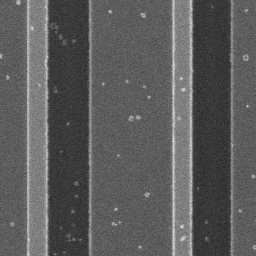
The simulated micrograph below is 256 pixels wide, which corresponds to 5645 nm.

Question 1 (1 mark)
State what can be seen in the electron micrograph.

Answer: lines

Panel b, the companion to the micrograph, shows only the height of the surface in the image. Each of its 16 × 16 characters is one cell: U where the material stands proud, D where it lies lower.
UUUDDDUUUUUUDDDU
UUUDDDUUUUUUDDDU
UUUDDDUUUUUUDDDU
UUUDDDUUUUUUDDDU
UUUDDDUUUUUUDDDU
UUUDDDUUUUUUDDDU
UUUDDDUUUUUUDDDU
UUUDDDUUUUUUDDDU
UUUDDDUUUUUUDDDU
UUUDDDUUUUUUDDDU
UUUDDDUUUUUUDDDU
UUUDDDUUUUUUDDDU
UUUDDDUUUUUUDDDU
UUUDDDUUUUUUDDDU
UUUDDDUUUUUUDDDU
UUUDDDUUUUUUDDDU